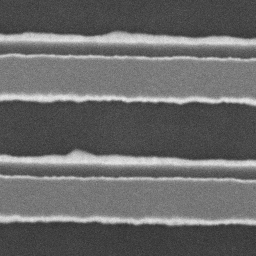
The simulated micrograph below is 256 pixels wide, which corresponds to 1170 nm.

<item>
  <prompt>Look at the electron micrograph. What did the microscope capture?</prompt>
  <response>lines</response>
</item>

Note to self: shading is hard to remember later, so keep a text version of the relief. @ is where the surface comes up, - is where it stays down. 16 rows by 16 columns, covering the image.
----------------
----------------
@@--------------
@@@@@@@@@@@@@@@@
@@@@@@@@@@@@@@@@
@@@@@@@@@@@@@@@@
----------------
----------------
----------------
----------------
@@@@@@@@@@@@@@@@
@@@@@@@@@@@@@@@@
@@@@@@@@@@@@@@@@
@@@@@@@@@@@@@@@@
----------------
----------------